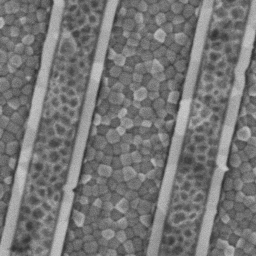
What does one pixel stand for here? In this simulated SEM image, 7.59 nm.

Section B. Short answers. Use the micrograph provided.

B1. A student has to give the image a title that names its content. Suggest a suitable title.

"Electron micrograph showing one or a few lines or trenches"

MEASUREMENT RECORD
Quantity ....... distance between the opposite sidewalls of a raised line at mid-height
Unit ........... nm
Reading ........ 382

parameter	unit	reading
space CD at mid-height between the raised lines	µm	0.701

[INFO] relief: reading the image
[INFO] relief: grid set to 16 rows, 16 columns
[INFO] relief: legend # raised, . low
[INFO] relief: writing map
....###......###
...####......###
...####.....####
...###......###.
...###......###.
...###......###.
..####......###.
..###......###..
..###......###..
..###......###..
.####......###..
.###......####..
.###......###...
.###......###...
.###......###...
####......###...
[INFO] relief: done